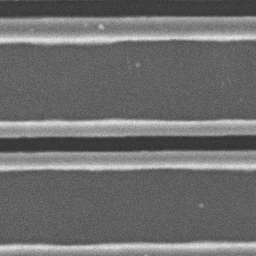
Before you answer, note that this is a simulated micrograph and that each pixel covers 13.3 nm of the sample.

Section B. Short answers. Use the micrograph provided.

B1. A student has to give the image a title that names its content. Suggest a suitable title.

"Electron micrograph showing lines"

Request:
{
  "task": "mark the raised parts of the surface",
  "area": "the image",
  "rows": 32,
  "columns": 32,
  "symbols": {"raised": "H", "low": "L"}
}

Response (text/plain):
LLLLLLLLLLLLLLLLLLLLLLLLLLLLLLLL
LLLLLLLLLLLLLLLLLLLLLLLLLLLLLLLL
HHHHHHHHHHHHHHHHHHHHHHHHHHHHHHHH
HHHHHHHHHHHHHHHHHHHHHHHHHHHHHHHH
HHHHHHHHHHHHHHHHHHHHHHHHHHHHHHHH
LLLLLLLLLLLLLLLLLLLLLLLLLLLLLLLL
LLLLLLLLLLLLLLLLLLLLLLLLLLLLLLLL
LLLLLLLLLLLLLLLLLLLLLLLLLLLLLLLL
LLLLLLLLLLLLLLLLLLLLLLLLLLLLLLLL
LLLLLLLLLLLLLLLLLLLLLLLLLLLLLLLL
LLLLLLLLLLLLLLLLLLLLLLLLLLLLLLLL
LLLLLLLLLLLLLLLLLLLLLLLLLLLLLLLL
LLLLLLLLLLLLLLLLLLLLLLLLLLLLLLLL
LLLLLLLLLLLLLLLLLLLLLLLLLLLLLLLL
LLLLLLLLLLLLLLLLLLLLLLLLLLLLLLLL
LLLLLHHHHHHHHHHHHHHHHHHHHHHHHHHH
HHHHHHHHHHHHHHHHHHHHHHHHHHHHHHHH
LLLLLLLLLLLLLLLLLLLLLLLLLLLLLLLL
LLLLLLLLLLLLLLLLLLLLLLLLLLLLLLLL
HHHHHHHHHHHHHHHHHHHHHHHHHHHHHHHH
HHHHHHHHHHHHHHHHHHHHHHHHHHHHHHHH
LLLLLLLLLLLLLLLLLLLLLLLLLLLLLLLL
LLLLLLLLLLLLLLLLLLLLLLLLLLLLLLLL
LLLLLLLLLLLLLLLLLLLLLLLLLLLLLLLL
LLLLLLLLLLLLLLLLLLLLLLLLLLLLLLLL
LLLLLLLLLLLLLLLLLLLLLLLLLLLLLLLL
LLLLLLLLLLLLLLLLLLLLLLLLLLLLLLLL
LLLLLLLLLLLLLLLLLLLLLLLLLLLLLLLL
LLLLLLLLLLLLLLLLLLLLLLLLLLLLLLLL
LLLLLLLLLLLLLLLLLLLLLLLLLLLLLLLL
LLLLLLLLLLLLLLLLLLLLLLLLLLLLLLLL
HHHHHHHHHHHHHHHHHHHHHHHHHHHHHHHH